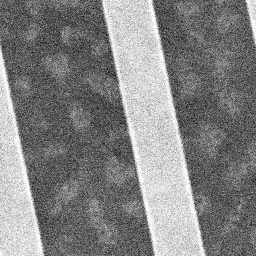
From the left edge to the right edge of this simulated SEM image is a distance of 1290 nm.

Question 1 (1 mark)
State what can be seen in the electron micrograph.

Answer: one or a few lines or trenches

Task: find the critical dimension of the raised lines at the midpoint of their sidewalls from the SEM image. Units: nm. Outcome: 234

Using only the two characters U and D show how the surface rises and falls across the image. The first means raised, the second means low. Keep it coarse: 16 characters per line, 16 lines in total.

DDDDDDDUUUDDDDDD
DDDDDDDUUUDDDDDD
DDDDDDDUUUDDDDDD
DDDDDDDUUUDDDDDD
DDDDDDDUUUDDDDDD
DDDDDDDDUUUDDDDD
UDDDDDDDUUUDDDDD
UDDDDDDDUUUDDDDD
UDDDDDDDUUUDDDDD
UDDDDDDDUUUDDDDD
UDDDDDDDDUUUDDDD
UUDDDDDDDUUUDDDD
UUDDDDDDDUUUDDDD
UUDDDDDDDUUUDDDD
UUDDDDDDDUUUDDDD
UUUDDDDDDDUUUDDD